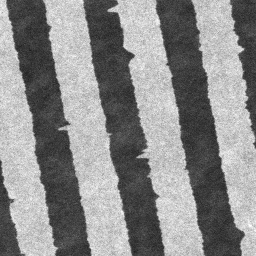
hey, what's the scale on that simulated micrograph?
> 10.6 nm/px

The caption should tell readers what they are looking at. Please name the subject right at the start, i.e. one or a few lines or trenches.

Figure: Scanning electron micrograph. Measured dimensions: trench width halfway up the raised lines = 376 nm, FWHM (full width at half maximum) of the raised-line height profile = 382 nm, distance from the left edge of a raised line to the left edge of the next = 760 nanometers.